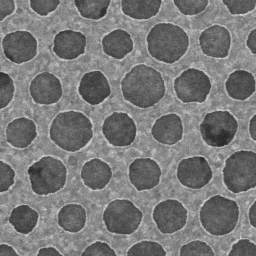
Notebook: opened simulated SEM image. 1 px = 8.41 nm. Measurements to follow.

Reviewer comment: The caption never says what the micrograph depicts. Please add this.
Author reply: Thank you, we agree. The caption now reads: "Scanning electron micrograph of a regular array of holes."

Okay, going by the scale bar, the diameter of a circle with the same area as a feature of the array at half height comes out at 289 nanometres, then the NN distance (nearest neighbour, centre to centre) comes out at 407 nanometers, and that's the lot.